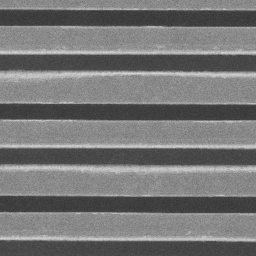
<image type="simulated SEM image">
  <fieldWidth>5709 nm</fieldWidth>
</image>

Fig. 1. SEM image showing lines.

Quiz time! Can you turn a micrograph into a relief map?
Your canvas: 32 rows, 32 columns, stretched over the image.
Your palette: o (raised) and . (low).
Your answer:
oooooooooooooooooooooooooooooooo
................................
................................
oooooooooooooooooooooooooooooooo
oooooooooooooooooooooooooooooooo
oooooooooooooooooooooooooooooooo
oooooooooooooooooooooooooooooooo
................................
................................
oooooooooooooooooooooooooooooooo
oooooooooooooooooooooooooooooooo
oooooooooooooooooooooooooooooooo
oooooooooooooooooooooooooooooooo
................................
................................
oooooooooooooooooooooooooooooooo
oooooooooooooooooooooooooooooooo
oooooooooooooooooooooooooooooooo
.............................ooo
................................
................................
oooooooooooooooooooooooooooooooo
oooooooooooooooooooooooooooooooo
oooooooooooooooooooooooooooooooo
................................
................................
................................
oooooooooooooooooooooooooooooooo
oooooooooooooooooooooooooooooooo
oooooooooooooooooooooooooooooooo
................................
................................